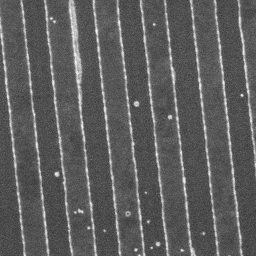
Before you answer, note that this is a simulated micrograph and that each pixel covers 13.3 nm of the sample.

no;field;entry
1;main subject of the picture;lines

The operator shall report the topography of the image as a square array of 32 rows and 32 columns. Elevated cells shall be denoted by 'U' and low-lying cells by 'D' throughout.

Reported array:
UUUDDDUUUDDDUUUDDDUUUDDDUUUDDDUU
UUUDDDUUUDDDUUUDDDUUUDDDUUUDDDUU
UUUDDDUUUDDDUUUDDDUUUDDDUUUDDDUU
UUUDDDUUUDDDUUUDDDUUUDDDUUUDDDUU
UUUDDDUUUDDDUUUDDDUUUDDDUUUDDDUU
UUUDDDUUUDDDUUUDDDUUUDDDUUUUDDUU
UUUDDDUUUDDDUUUDDDUUUDDDDUUUDDUU
UUUUDDUUUDDDUUUUDDUUUDDDDUUUDDDU
DUUUDDUUUUDDDUUUDDDUUUDDDUUUDDDU
DUUUDDDUUUDDDUUUDDDUUUDDDUUUDDDU
DUUUDDDUUUDDDUUUDDDUUUDDDUUUDDDU
DUUUDDDUUUDDDUUUDDDUUUDDDUUUDDDU
DUUUDDDUUUDDDUUUDDDUUUDDDUUUDDDU
DUUUDDDUUUDDDUUUDDDUUUDDDUUUDDDU
DUUUDDDUUUDDDUUUDDDUUUDDDUUUDDDU
DUUUDDDUUUDDDUUUDDDUUUDDDUUUUDDU
DUUUUDDUUUDDDUUUDDDUUUDDDDUUUDDU
DDUUUDDUUUUDDUUUUDDUUUUDDDUUUDDD
DDUUUDDDUUUDDDUUUDDUUUUDDDUUUDDD
DDUUUDDDUUUDDDUUUDDDUUUDDDUUUDDD
DDUUUDDDUUUDDDUUUDDDUUUDDDUUUDDD
DDUUUDDDUUUDDDUUUDDDUUUDDDUUUDDD
DDUUUDDDUUUDDDUUUDDDUUUDDDUUUDDD
DDUUUDDDUUUDDDUUUDDDUUUDDDUUUDDD
DDUUUDDDUUUDDDUUUDDDUUUDDDUUUDDD
DDUUUDDDUUUDDDUUUDDDUUUDDDUUUUDD
DDUUUUDDUUUDDDUUUDDDUUUDDDDUUUDD
DDDUUUDDUUUUDDDUUUDDUUUDDDDUUUDD
DDDUUUDDDUUUDDDUUUDDUUUUDDDUUUDD
DDDUUUDDDUUUDDDUUUDDDUUUDDDUUUDD
DDDUUUDDDUUUDDDUUUDDDUUUDDDUUUDD
DDDUUUDDDUUUDDDUUUDDDUUUDDDUUUDD